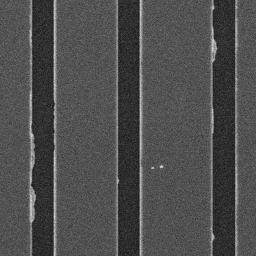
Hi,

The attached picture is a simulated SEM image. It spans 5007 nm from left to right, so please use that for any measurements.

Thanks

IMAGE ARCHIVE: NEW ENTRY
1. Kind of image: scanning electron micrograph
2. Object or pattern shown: lines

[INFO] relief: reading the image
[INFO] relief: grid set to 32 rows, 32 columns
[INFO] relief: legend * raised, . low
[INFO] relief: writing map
****...********...*********...**
****...********...*********...**
****...********...********....**
****...********...*********...**
****...********...*********...**
****...********...*********...**
****...********...*********...**
****...********...********....**
****...********...********....**
****...********...********....**
****...********...********....**
****...********...********....**
****...********...********....**
****...********...*********...**
****...********...*********...**
****...********...*********...**
****...********...*********...**
****...********...********....**
****...********...********....**
****...********...********....**
****...********...********....**
****...********...********....**
****...********...********....**
****...********...********....**
****...********...********....**
****...********...********....**
****...********...********....**
****...********...********....**
****...********...********....**
****...********...********....**
****...********...********....**
****...********...********....**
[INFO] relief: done